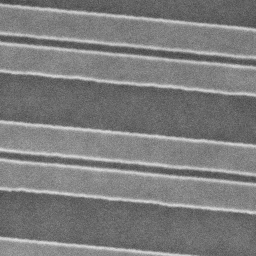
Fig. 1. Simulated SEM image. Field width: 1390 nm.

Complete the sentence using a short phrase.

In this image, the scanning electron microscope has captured lines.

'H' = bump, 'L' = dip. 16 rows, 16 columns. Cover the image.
HHLLLLLLLLLLLLLL
HHHHHHHHHHHHHLLL
HHHHHHHHHHHHHHHH
HHHHHHHHHHHHHHHH
HHHHHHHHHHHHHHHH
LLLLLLLLLLLHHHHH
LLLLLLLLLLLLLLLL
LLLLLLLLLLLLLLLL
HHHHHHHHHHLLLLLL
HHHHHHHHHHHHHHHH
HHHHHHHHHHHHHHHH
HHHHHHHHHHHHHHHH
LLLLLLLLHHHHHHHH
LLLLLLLLLLLLLLLL
LLLLLLLLLLLLLLLL
HHHHHHHLLLLLLLLL